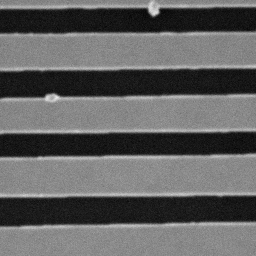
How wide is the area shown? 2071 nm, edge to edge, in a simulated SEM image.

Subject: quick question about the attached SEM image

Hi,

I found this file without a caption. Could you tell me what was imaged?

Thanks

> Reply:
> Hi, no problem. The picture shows lines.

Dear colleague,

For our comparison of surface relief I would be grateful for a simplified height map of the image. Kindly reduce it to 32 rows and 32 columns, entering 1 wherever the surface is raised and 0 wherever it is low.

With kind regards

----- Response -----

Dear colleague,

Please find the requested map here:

11111111111111111111111111111111
00000000000000000001000000000000
00000000000000000000000000000000
00000000000000000000000000000000
11111111111111111111111111111111
11111111111111111111111111111111
11111111111111111111111111111111
11111111111111111111111111111111
11111111111111111111100010000000
00000000000000000000000000000000
00000000000000000000000000000000
00000000000000000000000000000000
11111111111111111111111111111111
11111111111111111111111111111111
11111111111111111111111111111111
11111111111111111111111111111111
11111111111111000000000000000000
00000000000000000000000000000000
00000000000000000000000000000000
00000000000000000000000000111111
11111111111111111111111111111111
11111111111111111111111111111111
11111111111111111111111111111111
11111111111111111111111111111111
11111111100000000000000000000000
00000000000000000000000000000000
00000000000000000000000000000000
00000000000000000000000000000000
11111111111111111111111111111111
11111111111111111111111111111111
11111111111111111111111111111111
11111111111111111111111111111111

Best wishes